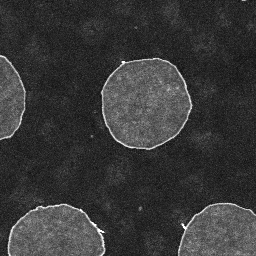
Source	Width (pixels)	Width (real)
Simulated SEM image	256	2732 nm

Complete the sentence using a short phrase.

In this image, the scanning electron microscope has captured raised bodies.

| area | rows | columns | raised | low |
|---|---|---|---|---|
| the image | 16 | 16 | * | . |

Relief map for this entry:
................
................
................
................
*......****.....
*.....******....
**....******....
*......*****....
*......****.....
................
................
................
................
..***.......****
.*****......****
.******....*****